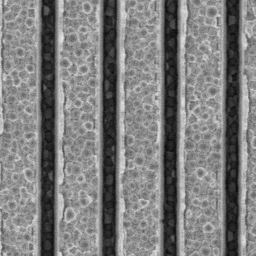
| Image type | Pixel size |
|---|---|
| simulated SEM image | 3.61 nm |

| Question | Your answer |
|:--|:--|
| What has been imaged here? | one or a few lines or trenches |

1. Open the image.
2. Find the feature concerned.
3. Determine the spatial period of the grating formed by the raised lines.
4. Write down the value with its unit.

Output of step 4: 61.3 pixels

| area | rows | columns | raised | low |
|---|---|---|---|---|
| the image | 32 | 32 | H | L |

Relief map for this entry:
HHHHHLLHHHHHHLLHHHHHLLLHHHHHLLHH
HHHHHLLHHHHHHLLHHHHHLLHHHHHHLLHH
HHHHHLLHHHHHHLLHHHHHLLLHHHHHLLHH
HHHHHLLHHHHHHLLHHHHHLLLHHHHHLLHH
HHHHHLLHHHHHHLLHHHHHLLHHHHHHLLHH
HHHHHLLHHHHHHLLHHHHHLLHHHHHHLLHH
HHHHHLLHHHHHHLLHHHHHLLHHHHHHLLHH
HHHHHLLHHHHHHLLHHHHHLLHHHHHHLLHH
HHHHHLLHHHHHHLLHHHHHLLLHHHHHLLHH
HHHHHLLHHHHHHLLHHHHHLLLHHHHHLLHH
HHHHHLLHHHHHHLLHHHHHLLLHHHHHLLHH
HHHHHLLHHHHHHLLHHHHHLLLHHHHHLLHH
HHHHHLLHHHHHHLLHHHHHLLLHHHHHLLHH
HHHHHLLHHHHHHLLHHHHHLLLHHHHHLLHH
HHHHHLLHHHHHHLLHHHHHLLHHHHHHLLHH
HHHHHLLHHHHHHLLHHHHHLLLHHHHHLLHH
HHHHHLLHHHHHHLLHHHHHLLLHHHHHLLHH
HHHHHLLHHHHHHLLHHHHHLLHHHHHHLLHH
HHHHHLLHHHHHHLLHHHHHLLHHHHHHLLHH
HHHHHLLHHHHHHLLHHHHHLLHHHHHHLLHH
HHHHHLLHHHHHHLLHHHHHLLHHHHHHLLHH
HHHHHLLHHHHHLLLHHHHHLLHHHHHHLLHH
HHHHHLLHHHHHLLLHHHHHLLHHHHHHLLHH
HHHHHLLHHHHHLLLHHHHHLLHHHHHHLLHH
HHHHHLLHHHHHLLLHHHHHLLHHHHHHLLHH
HHHHHLLHHHHHLLLHHHHHLLHHHHHHLLHH
HHHHHLLHHHHHLLLHHHHHLLHHHHHHLLHH
HHHHHLLHHHHHLLLHHHHHLLHHHHHHLLHH
HHHHHLLHHHHHLLLHHHHHLLHHHHHHLLHH
HHHHHLLHHHHHLLLHHHHHLLHHHHHHLLHH
HHHHHLLHHHHHLLLHHHHHLLHHHHHHLLHH
HHHHHLLHHHHHLLLHHHHHLLHHHHHHLLHH